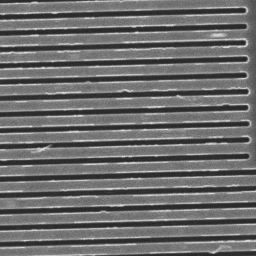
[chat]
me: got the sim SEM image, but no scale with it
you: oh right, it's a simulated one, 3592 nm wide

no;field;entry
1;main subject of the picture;parallel lines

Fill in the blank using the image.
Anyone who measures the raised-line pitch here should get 228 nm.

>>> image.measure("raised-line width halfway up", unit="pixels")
10.9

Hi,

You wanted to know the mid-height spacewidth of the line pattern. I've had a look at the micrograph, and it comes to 0.0701 micrometres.